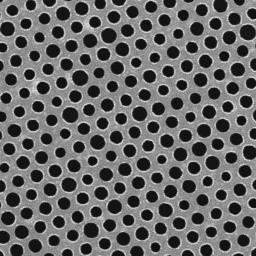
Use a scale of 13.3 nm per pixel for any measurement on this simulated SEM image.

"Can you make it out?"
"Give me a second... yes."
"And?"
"a regular array of holes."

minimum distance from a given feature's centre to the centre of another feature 0.253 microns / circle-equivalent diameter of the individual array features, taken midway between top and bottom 164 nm